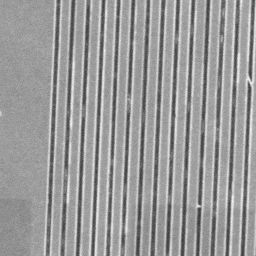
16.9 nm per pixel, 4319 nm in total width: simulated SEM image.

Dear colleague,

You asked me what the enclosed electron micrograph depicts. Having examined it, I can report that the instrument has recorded parallel lines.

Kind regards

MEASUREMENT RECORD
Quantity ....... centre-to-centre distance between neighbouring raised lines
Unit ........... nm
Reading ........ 252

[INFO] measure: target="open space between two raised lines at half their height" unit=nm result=90.6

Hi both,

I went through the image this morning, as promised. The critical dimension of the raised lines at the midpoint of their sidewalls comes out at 166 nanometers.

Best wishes